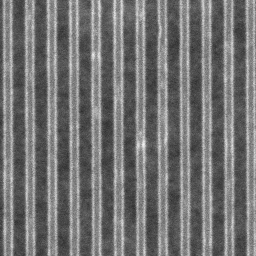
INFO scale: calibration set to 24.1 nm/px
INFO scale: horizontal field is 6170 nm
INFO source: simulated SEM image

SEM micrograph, parallel lines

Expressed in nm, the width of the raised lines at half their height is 392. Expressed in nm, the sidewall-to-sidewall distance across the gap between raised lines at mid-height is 145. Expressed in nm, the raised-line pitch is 533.